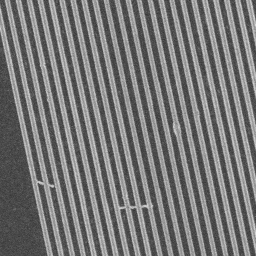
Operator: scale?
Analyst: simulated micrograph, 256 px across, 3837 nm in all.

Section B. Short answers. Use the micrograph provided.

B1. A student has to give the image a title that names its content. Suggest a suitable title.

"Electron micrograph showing parallel lines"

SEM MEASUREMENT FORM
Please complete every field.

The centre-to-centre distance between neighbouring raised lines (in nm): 161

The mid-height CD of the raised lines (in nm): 58.7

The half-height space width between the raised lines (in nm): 103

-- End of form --